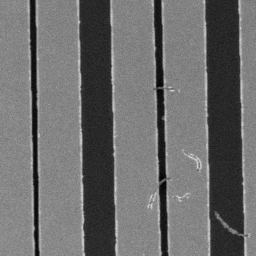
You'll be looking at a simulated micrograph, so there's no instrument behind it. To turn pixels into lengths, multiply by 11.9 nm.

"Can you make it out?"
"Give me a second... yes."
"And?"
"lines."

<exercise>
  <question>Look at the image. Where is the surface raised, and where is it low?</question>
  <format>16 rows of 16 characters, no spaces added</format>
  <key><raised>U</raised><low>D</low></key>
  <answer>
UUUUUDDUUUUUUDDU
UUUUUDDUUUUUUDDU
UUUUUDDUUUUUUDDU
UUUUUDDUUUUUUDDU
UUUUUDDUUUUUUDDU
UUUUUDDUUUUUUDDU
UUUUUDDUUUUUUDDU
UUUUUDDUUUUUUDDU
UUUUUDDUUUUUUDDU
UUUUUDDUUUUUUDDU
UUUUUDDUUUUUUDDU
UUUUUDDUUUUUUDDU
UUUUUDDUUUUUUDDU
UUUUUDDUUUUUUDDU
UUUUUDDUUUUUUDDU
UUUUUDDUUUUUUDDU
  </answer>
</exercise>